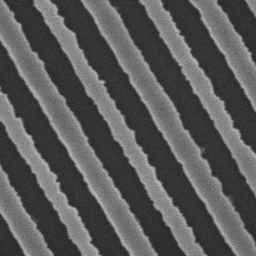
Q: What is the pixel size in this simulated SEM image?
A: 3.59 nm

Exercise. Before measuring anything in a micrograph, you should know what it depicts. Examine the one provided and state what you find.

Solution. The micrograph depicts lines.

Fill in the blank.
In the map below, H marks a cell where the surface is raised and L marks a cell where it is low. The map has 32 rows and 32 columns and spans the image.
HLLLHHHLLLHHHHLLLLHHLLLLHHHLLLLH
HLLLLHHLLLLHHHHLLLHHHLLLLHHHLLLL
HHLLLLHHLLLLHHHLLLLHHHLLLHHHHLLL
HHHLLLHHLLLLHHHHLLLLHHLLLLHHHLLL
HHHLLLLHHLLLLHHHLLLLHHHLLLHHHHLL
HHHHLLLLHHLLLLHHHLLLLHHLLLLHHHLL
LHHHLLLLHHLLLLHHHLLLLHHHLLLLHHHL
LLHHHLLLLHHLLLLHHHLLLLHHLLLLHHHH
LLHHHHLLLHHLLLLHHHHLLLLHHLLLLHHH
LLLHHHLLLLHHLLLLHHHLLLLHHHLLLHHH
LLLHHHHLLLHHHLLLHHHHLLLLHHLLLLHH
LLLLHHHLLLLHHLLLLHHHHLLLHHHLLLLH
HLLLLHHHLLLLHHLLLLHHHLLLLHHHLLLH
HHLLLHHHHLLLHHHLLLHHHHLLLLHHLLLL
HHLLLLHHHLLLLHHLLLLHHHLLLLHHHLLL
HHHLLLHHHHLLLHHHLLLHHHHLLLLHHLLL
LHHLLLLHHHLLLLHHHLLLHHHLLLLHHHLL
LHHHLLLLHHHLLLLHHLLLLHHHLLLLHHLL
LLHHLLLLHHHLLLLHHHLLLHHHHLLLLHHL
LLLHHLLLLHHHLLLLHHLLLLHHHLLLLHHH
LLLLHHLLLHHHHLLLHHHLLLLHHHLLLLHH
HLLLHHHLLLHHHLLLLHHLLLLHHHLLLLHH
HLLLLHHLLLLHHHLLLLHHLLLLHHHLLLLH
HHLLLHHLLLLHHHLLLLHHLLLLHHHHLLLH
HHLLLLHHLLLLHHHLLLLHHLLLLHHHLLLL
HHHLLLLHHLLLHHHHLLLHHHLLLLHHHLLL
HHHLLLLHHHLLLHHHLLLLHHLLLLHHHHLL
LHHHLLLLHHLLLLHHHLLLHHHLLLLHHHLL
LHHHHLLLHHHLLLHHHHLLLHHHLLLHHHHL
LLHHHLLLLHHLLLLHHHLLLLHHLLLLHHHL
LLHHHHLLLHHHLLLHHHHLLLHHHLLLHHHH
LLLHHHLLLLHHLLLLHHHLLLLHHLLLLHHH